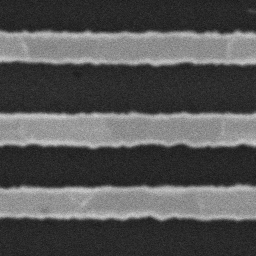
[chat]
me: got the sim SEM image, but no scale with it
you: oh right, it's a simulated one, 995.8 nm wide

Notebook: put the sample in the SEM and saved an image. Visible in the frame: lines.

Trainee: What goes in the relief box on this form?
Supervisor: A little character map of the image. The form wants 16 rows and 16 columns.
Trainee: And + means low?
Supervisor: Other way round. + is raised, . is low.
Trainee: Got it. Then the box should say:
................
................
++++++++++++++++
++++++++++++++++
................
................
................
++++++++++++++++
++++++++++++++++
................
................
................
++++++++++++++++
++++++++++++++++
................
................